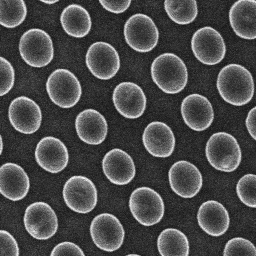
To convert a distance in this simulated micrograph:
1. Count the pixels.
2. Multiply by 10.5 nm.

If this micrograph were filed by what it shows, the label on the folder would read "a regular array of raised bodies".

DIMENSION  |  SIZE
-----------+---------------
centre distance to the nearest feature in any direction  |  0.494 um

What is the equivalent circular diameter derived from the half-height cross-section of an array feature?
0.36 µm